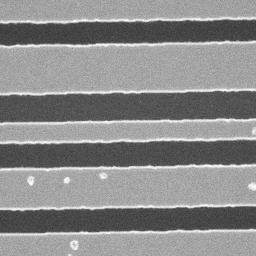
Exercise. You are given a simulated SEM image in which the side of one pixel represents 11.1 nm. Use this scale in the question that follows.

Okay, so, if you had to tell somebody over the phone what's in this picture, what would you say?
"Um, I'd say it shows lines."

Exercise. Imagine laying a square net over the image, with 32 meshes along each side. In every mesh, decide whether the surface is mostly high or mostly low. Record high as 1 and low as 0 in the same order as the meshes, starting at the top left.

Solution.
11111111111111111111111111111111
11111111111111111111111111111111
11111111111111111110000000000000
00000000000000000000000000000000
00000000000000000000000000000000
00000000000000000000111111111111
11111111111111111111111111111111
11111111111111111111111111111111
11111111111111111111111111111111
11111111111111111111111111111111
11111111111111111111111111111111
11111111111111011100010000000000
00000000000000000000000000000000
00000000000000000000000000000000
00000000000000000000000000000000
11111111111111111111111111111111
11111111111111111111111111111111
11111111111111111110000000000000
00000000000000000000000000000000
00000000000000000000000000000000
00000000000000000000000000000000
11111111111111111111111111111111
11111111111111111111111111111111
11111111111111111111111111111111
11111111111111111111111111111111
11111111111111111111111111111111
00000000000000000000000000000000
00000000000000000000000000000000
00000000000000000000000000000000
11111111111111111111111111111111
11111111111111111111111111111111
11111111111111111111111111111111